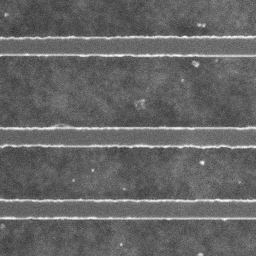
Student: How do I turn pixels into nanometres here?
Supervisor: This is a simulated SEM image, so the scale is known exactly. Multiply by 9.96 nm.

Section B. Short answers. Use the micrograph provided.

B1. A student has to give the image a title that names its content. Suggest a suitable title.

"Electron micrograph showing lines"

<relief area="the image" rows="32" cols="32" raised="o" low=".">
................................
................................
................................
................................
................................
oooooooooooooooooooooooooooooooo
oooooooooooooooooooooooooooooooo
................................
................................
................................
................................
................................
................................
................................
................................
................................
oooooooooooooooooooooooooooooooo
oooooooooooooooooooooooooooooooo
.........................o...o..
................................
................................
................................
................................
................................
................................
oooooooooooooooooooooooooooooooo
oooooooooooooooooooooooooooooooo
................................
................................
................................
................................
................................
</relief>